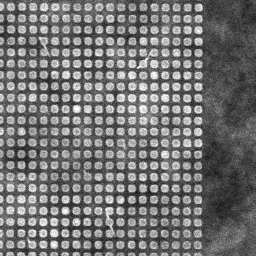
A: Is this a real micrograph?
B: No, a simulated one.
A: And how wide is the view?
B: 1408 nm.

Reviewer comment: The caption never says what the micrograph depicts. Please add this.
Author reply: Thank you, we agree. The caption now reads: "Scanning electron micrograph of a regular array of raised bodies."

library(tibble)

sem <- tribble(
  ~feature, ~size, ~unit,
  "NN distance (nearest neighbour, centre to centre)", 60.1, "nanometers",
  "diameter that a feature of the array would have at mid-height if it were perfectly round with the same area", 42.5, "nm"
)